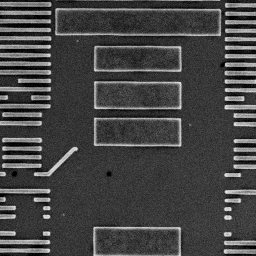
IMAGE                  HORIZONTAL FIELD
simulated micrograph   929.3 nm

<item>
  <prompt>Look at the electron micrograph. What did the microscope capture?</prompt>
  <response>wiring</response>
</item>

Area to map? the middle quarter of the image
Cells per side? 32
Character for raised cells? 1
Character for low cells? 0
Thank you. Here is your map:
00000000111111111111111111111000
00000000111111111111111111111000
00000000000000000000000000000000
00000000000000000000000000000000
00000000111111111100000000000000
00000000111111111111111111111000
00000000111111111111111111111000
00000000111111111111111111111000
00000000111111111111111111111000
00000000111111111111111111111000
00000000111111111111111111111000
00000000000000000000000000000000
00000000000000000000000000000000
00000000000000000000000000000000
00000000111111111111111111111000
00000000111111111111111111111000
00000000111111111111111111111000
00000000111111111111111111111000
00000000111111111111111111111000
00000000111111111111111111111000
00000000000000001111111111111000
00100000000000000000000000000000
11000000000000000000000000000000
10000000000000000000000000000000
00000000000000000000000000000000
00000000000000000000000000000000
00000000000000000000000000000000
00000000000000000000000000000000
00000000000000000000000000000000
00000000000000000000000000000000
00000000000000000000000000000000
00000000000000000000000000000000